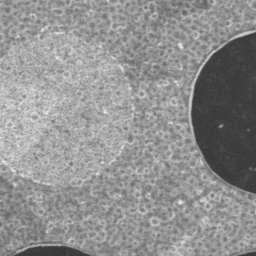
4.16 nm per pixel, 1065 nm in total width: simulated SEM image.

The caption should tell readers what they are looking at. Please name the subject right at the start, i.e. holes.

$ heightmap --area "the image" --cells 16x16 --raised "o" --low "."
oooooooooooooooo
oooooooooooooooo
oooooooooooooo..
ooooooooooooo...
oooooooooooo....
oooooooooooo....
oooooooooooo....
oooooooooooo....
oooooooooooo....
ooooooooooooo...
ooooooooooooo...
oooooooooooooo..
oooooooooooooooo
oooooooooooooooo
oooooooooooooooo
oo...ooooooooooo